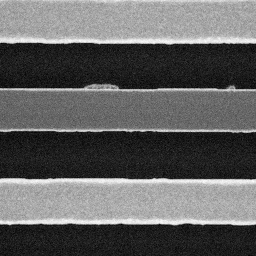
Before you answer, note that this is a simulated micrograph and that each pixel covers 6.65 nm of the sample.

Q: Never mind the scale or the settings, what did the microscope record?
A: lines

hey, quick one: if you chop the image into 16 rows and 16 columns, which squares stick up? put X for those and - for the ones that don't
XXXXXXXXXXXXXXXX
XXXXXXXXXXXXXXXX
XXXXXXXXXXXXXXXX
----------------
----------------
----------------
XXXXXXXXXXXXXXXX
XXXXXXXXXXXXXXXX
----------------
----------------
----------------
XXXXXXXXXXXXXXXX
XXXXXXXXXXXXXXXX
XXXXXXXXXXXXXXXX
----------------
----------------